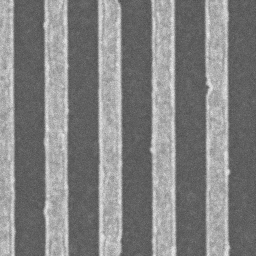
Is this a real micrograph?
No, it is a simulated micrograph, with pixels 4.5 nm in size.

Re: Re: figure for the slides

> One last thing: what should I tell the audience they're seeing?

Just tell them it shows parallel lines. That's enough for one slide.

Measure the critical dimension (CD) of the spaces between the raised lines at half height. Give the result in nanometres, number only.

146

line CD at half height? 94.6 nanometres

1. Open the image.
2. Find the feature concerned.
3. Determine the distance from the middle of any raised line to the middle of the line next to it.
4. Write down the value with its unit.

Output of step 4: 242 nm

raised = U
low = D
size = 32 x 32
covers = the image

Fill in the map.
UUDDDDUUDDDDDUUDDDDUUUDDDDUUDDDD
UUDDDDUUDDDDDUUDDDDUUUDDDDUUUDDD
UUDDDDUUDDDDDUUDDDDUUUDDDDUUUDDD
UUDDDDUUDDDDDUUDDDDUUUDDDDUUDDDD
UUDDDDUUDDDDUUUDDDDUUUDDDDUUDDDD
UUDDDDUUDDDDDUUDDDDUUUDDDDUUDDDD
UUDDDDUUDDDDUUUDDDDUUUDDDDUUDDDD
UUDDDDUUDDDDUUUDDDDUUUDDDDUUDDDD
UUDDDDUUDDDDDUUDDDDUUUDDDDUUDDDD
UUDDDDUUDDDDDUUDDDDUUUDDDDUUDDDD
UUDDDDUUDDDDDUUDDDDUUUDDDDUUDDDD
UUDDDDUUDDDDDUUDDDDUUUDDDDUUDDDD
UUDDDDUUDDDDDUUDDDDUUUDDDDUUDDDD
UUDDDDUUDDDDDUUDDDDUUUDDDDUUDDDD
UUDDDDUUDDDDDUUDDDDUUUDDDDUUDDDD
UUDDDDUUDDDDDUUDDDDUUUDDDDUUDDDD
UUDDDDUUDDDDUUUDDDDUUUDDDDUUDDDD
UUDDDDUUDDDDDUUDDDDUUUDDDDUUDDDD
UUDDDDUUDDDDUUUDDDDUUUDDDDUUDDDD
UUDDDDUUDDDDUUUDDDDUUUDDDDUUDDDD
UUDDDDUUDDDDDUUDDDDUUUDDDDUUDDDD
UUDDDDUUDDDDDUUDDDDUUUDDDDUUUDDD
UUDDDDUUDDDDDUUDDDDUUUDDDDUUDDDD
UUDDDDUUDDDDDUUDDDDUUUDDDDUUDDDD
UUDDDDUUDDDDDUUDDDDUUUDDDDUUDDDD
UUDDDDUUDDDDDUUDDDDUUUDDDDUUDDDD
UUDDDDUUDDDDDUUDDDDUUUDDDDUUDDDD
UUDDDDUUDDDDDUUDDDDUUUDDDDUUDDDD
UUDDDDUUDDDDDUUDDDDUUUDDDDUUDDDD
UUDDDDUUDDDDDUUDDDDUUUDDDDUUDDDD
UUDDDDUUDDDDDUUDDDDUUUDDDDUUUDDD
UUDDDDUUDDDDDUUDDDDUUUDDDDUUUDDD